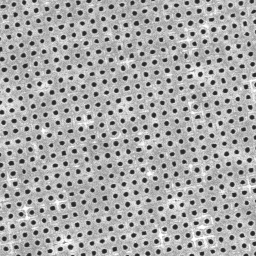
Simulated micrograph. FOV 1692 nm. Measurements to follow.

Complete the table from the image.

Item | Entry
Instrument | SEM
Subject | a regular array of holes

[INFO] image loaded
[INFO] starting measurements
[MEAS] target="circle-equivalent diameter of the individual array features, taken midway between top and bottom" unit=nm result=31.7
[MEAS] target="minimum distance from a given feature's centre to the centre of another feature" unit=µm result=0.0674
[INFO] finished